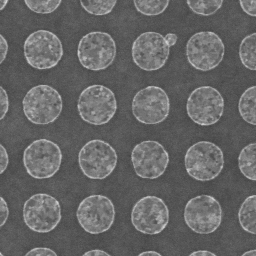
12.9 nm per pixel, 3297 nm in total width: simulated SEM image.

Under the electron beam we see a regular array of raised bodies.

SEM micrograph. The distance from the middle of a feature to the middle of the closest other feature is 53.7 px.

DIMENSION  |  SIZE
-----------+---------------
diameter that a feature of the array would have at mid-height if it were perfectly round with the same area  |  0.483 micrometres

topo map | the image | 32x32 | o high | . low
o..oooo...oooo...oooo...oooo..oo
....oo.....oo.....oo.....oo....o
................................
................................
....ooo....ooo....oo....ooo....o
o..ooooo..oooo...oooo..ooooo..oo
o..ooooo..oooo...oooo..ooooo..oo
...oooo...oooo...oooo...oooo..oo
.....o.....oo.....oo.....o.....o
................................
................................
o...ooo...oooo...ooo....ooo....o
o..ooooo..oooo...oooo...oooo..oo
o..ooooo..oooo...oooo..ooooo..oo
...oooo...oooo...oooo...oooo..oo
................................
................................
.....o..........................
....ooo...oooo...ooo....ooo....o
o..ooooo..ooooo..oooo..ooooo..oo
o..oooo...oooo...oooo..ooooo..oo
....ooo....ooo...ooo....ooo...oo
................................
................................
....oo.........................o
o..oooo...oooo...ooo...oooo...oo
o..oooo...oooo...oooo..ooooo..oo
o..oooo...oooo...oooo..ooooo..oo
....ooo....oo....ooo....ooo....o
................................
................................
....ooo....oo.....o......o.....o